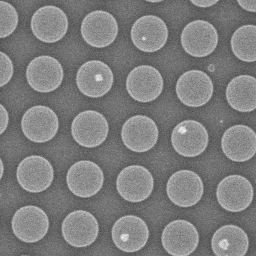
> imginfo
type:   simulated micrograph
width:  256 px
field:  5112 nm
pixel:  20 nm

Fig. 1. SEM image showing an array of small figures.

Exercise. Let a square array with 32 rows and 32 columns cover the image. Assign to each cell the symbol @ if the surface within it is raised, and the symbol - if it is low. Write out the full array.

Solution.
@-----------------------@@@---@@
@@---@@@----@-------------------
@@--@@@@---@@@---@@@------------
@@--@@@@--@@@@@--@@@@--@@@@---@@
@----@@@--@@@@--@@@@@--@@@@--@@@
-----------@@@---@@@---@@@@--@@@
-----------------------@@@---@@@
@---@@@-----------------------@@
@@-@@@@@--@@@@---@@-------------
@--@@@@@--@@@@--@@@@---@@@----@-
@---@@@---@@@@--@@@@--@@@@---@@@
----------@@@---@@@@--@@@@--@@@@
-----------------@@----@@@---@@@
----@@-----------------------@@@
@--@@@@---@@@-------------------
@--@@@@--@@@@---@@@---@@@-------
---@@@@--@@@@--@@@@@--@@@@--@@@@
----@@---@@@@--@@@@@--@@@@--@@@@
----------------@@@---@@@@--@@@@
-----------------------@----@@@-
---@@@---@@@--------------------
--@@@@@--@@@@--@@@@---@@--------
--@@@@--@@@@@--@@@@--@@@@---@@@-
---@@@---@@@@--@@@@--@@@@--@@@@-
----------@----@@@---@@@@--@@@@@
----------------------@@----@@@-
--@@@----@@---------------------
--@@@@--@@@@---@@@--------------
--@@@@--@@@@--@@@@---@@@----@@--
--@@@---@@@@--@@@@--@@@@@--@@@@-
---------@@---@@@@--@@@@@--@@@@-
---------------------@@@---@@@@-